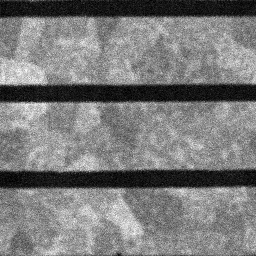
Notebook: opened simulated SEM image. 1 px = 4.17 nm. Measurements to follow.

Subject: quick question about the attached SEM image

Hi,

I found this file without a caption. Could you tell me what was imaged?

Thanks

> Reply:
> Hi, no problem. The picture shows one or a few lines or trenches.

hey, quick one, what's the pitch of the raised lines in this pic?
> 356 nm